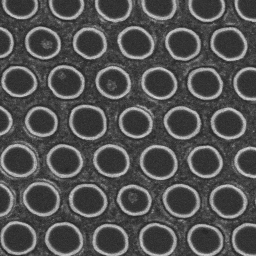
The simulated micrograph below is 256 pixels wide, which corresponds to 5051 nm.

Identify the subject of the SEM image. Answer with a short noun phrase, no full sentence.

a regular array of raised bodies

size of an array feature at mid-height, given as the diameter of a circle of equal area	628	nanometres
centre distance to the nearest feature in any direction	0.894	micrometres